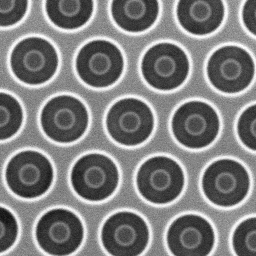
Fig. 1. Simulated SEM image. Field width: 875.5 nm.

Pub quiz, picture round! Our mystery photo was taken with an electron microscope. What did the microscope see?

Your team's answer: an array of small figures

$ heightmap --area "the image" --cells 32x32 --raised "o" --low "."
....oo......oo......oo......oo..
...ooo......oo......oo......oo..
...ooo.....ooo......oo......oo..
ooooooo...ooooo....oooo....oooo.
oooooooooooooooooooooooooooooooo
oo.....oooo...ooooo...oooooooooo
o......ooo.....ooo.....oooo....o
o......oo.......oo......oo......
o......oo.......oo......oo......
oo.....ooo.....ooo.....ooo......
ooo..oooooo...oooo.....ooo.....o
oooooooooooooooooooooooooooo..oo
..oooo....ooooo...oooooo.ooooooo
...oo......ooo.....ooo.....oooo.
...oo......oo......ooo.....ooo..
...oo......oo......oo.......oo..
..ooo......oo......oo......ooo..
.ooooo....oooo....oooo.....ooo..
ooooooooooooooooooooooo..oooooo.
oo....oooo...oooooo..ooooooooooo
o.....ooo.....oooo....oooo....oo
o......oo......oo......oo......o
o......oo......oo......oo......o
o.....ooo......oo......oo......o
oo...ooooo....oooo....oooo.....o
ooooooooooooooooooo..oooooo...oo
.ooooo...oooooo..ooooooooooooooo
..ooo.....ooo.....oooo....oooo..
..oo......ooo......oo......oo...
..oo......ooo......oo......oo...
..ooo.....ooo......oo......oo...
.ooooo...oooo.....ooo.....ooo...